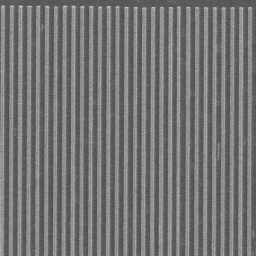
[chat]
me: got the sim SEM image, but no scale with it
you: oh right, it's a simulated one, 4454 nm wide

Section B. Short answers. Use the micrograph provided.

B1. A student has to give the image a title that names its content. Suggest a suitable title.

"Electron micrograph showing parallel lines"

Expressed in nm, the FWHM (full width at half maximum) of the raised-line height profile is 58.7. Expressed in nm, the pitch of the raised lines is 154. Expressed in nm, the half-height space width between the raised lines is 102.